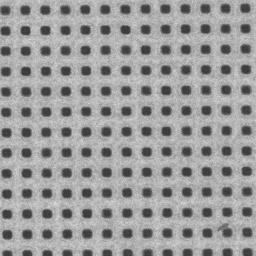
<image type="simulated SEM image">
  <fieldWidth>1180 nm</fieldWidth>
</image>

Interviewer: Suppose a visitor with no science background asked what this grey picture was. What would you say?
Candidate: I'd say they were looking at a regular array of holes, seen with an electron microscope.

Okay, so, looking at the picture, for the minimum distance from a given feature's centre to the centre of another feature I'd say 91.9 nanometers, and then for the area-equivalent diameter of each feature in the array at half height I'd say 48.8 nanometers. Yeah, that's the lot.